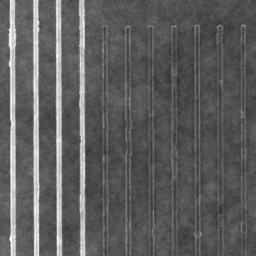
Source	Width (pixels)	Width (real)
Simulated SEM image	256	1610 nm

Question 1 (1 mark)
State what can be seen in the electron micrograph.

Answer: parallel lines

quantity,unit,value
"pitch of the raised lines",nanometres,145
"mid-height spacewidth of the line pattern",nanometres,120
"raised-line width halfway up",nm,28.3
